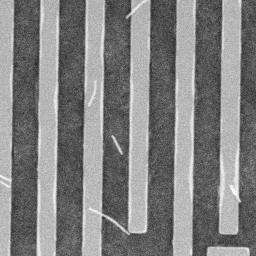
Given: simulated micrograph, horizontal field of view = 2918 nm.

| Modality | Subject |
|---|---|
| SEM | groups of lines, slits or small figures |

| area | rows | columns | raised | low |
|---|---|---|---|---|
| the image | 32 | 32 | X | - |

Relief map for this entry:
XX---XX----XX----XX---XX----XX--
XX---XX----XX---XXX---XX----XX--
XX---XX----XX----XX---XX----XX--
XX---XX----XX----XX---XX----XX--
XX---XX----XX---XXX---XX----XX--
XX---XX----XX---XXX---XX----XX--
XX---XX----XX---XXX---XX----XX--
XX---XX----XX---XXX---XX----XX--
XX---XX----XX----XX---XX----XX--
X----XX----XX---XXX---XX----XX--
X----XX----XX----XX---XX----XX--
X----XX----XX----XX---XX----XX--
XX---XX----XX----XX---XX----XX--
XX---XX----XX---XXX---XX----XX--
XX---XX----XX---XXX---XX----XX--
X----XX----XX---XXX---XX----XX--
X----XX----XX---XX----XX----XX--
X----XX----XX---XX----XX----XX--
XX---XX----XX---XX----XX----XX--
XX---XX----XX---XX----XX----XX--
X----XX----XX---XX----XX----XX--
X----XX----XX---XX----XX----XX--
X----XX----XX---XX----XX----XX--
X----XX----XX---XX----XX----XX--
X----XX----XX---XX----XX----XX--
X----XX----XX---XX----XX----XX--
X----XX----XX---XX----XX----XX--
X----XX----XX---XX----XX---XXX--
X----XX---XXX---XX----XX---XXX--
X----XX---XXX---------XX--------
X----XX---XXX---------XX--------
X----XX---XXX---------XX--XXXXX-